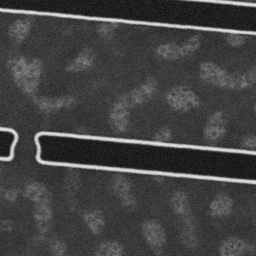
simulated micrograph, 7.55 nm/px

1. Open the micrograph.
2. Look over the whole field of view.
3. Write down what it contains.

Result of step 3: one or a few lines or trenches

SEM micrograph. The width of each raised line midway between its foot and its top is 29.4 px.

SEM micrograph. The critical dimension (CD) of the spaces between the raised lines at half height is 892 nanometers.